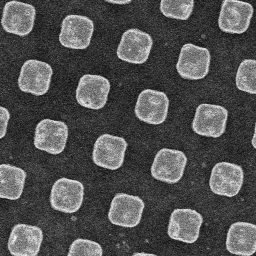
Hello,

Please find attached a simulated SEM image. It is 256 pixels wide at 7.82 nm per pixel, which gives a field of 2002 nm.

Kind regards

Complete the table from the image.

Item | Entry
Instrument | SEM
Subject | a regular array of raised bodies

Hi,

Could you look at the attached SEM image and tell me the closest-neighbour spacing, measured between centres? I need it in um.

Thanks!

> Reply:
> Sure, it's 0.469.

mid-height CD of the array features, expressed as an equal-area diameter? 0.268 microns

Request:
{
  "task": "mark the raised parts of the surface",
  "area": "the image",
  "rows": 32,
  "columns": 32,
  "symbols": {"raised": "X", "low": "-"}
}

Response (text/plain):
-XX-----------------XXXX----XXX-
XXXX----------------XXXX----XXXX
XXXX----XXX----------------XXXX-
-XXX----XXXX----------------XXX-
-------XXXX----XXXX-------------
--------XXX----XXXX-------------
---------------XXXX----XXX------
---------------XXX----XXXX------
---XXX----------------XXXX----XX
--XXXX----XX-----------XX-----XX
--XXXX----XXXX----------------XX
----XX----XXXX----XX-----------X
----------XXX----XXXX-----------
-----------X-----XXXX----XXX----
X----------------XXXX---XXXX----
X----XXX----------------XXXX----
X----XXX----------------XXXX----
----XXXX----XXX-----------------
-----XXX----XXXX----------------
------------XXX----XXXX---------
------------XXX----XXXX----XX---
XXX----------------XXXX----XXX--
XXX----XX-----------XX----XXXX--
XXX----XXX----------------XXXX--
XX----XXXX-----XX---------------
------XXXX----XXXX--------------
--------X-----XXXX----XX--------
--------------XXX----XXXX-------
--XXX----------------XXXX----XXX
-XXXX----------------XXXX---XXXX
-XXXX----XXX----------------XXXX
-XXXX----XXXX----------------XXX